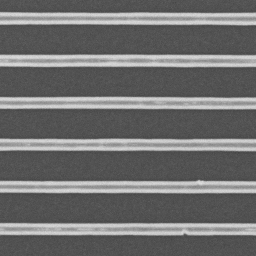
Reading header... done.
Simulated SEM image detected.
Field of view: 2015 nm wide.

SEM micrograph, parallel lines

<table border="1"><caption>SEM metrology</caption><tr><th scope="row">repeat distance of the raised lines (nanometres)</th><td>331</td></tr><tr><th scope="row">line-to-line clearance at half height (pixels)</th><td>32.6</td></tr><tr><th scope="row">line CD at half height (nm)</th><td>72.8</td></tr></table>